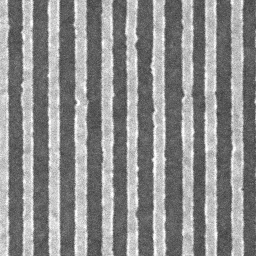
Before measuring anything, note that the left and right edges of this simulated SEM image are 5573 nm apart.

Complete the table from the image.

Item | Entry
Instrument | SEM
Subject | parallel lines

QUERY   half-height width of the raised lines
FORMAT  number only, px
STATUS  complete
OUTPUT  9.62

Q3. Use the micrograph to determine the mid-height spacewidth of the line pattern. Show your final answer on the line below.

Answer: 365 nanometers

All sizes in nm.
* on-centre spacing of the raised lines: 570